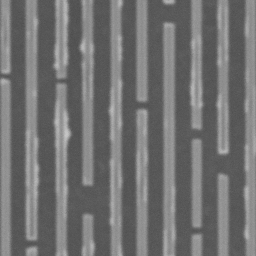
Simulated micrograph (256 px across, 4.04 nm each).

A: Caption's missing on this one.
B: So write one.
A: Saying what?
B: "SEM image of parallel lines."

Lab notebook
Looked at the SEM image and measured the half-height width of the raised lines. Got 38.9 nanometers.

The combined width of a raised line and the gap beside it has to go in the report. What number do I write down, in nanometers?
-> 110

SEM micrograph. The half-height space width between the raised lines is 70.2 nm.